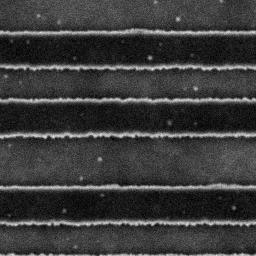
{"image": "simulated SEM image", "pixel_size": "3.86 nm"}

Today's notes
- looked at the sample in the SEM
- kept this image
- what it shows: lines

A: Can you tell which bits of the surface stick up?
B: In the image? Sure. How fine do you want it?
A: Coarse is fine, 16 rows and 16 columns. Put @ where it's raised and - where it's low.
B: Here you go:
----------------
----------------
@@@@@@@@@@@@@@@@
@@@@@@@@@@@@@@@@
----------------
----------------
@@@@@@@@@@@@@@@@
@@@@@@@@@@@@@@@@
@@@@@@@@-@@@@@@@
----------------
----------------
----------------
@@@@@@@@@@@@@@@@
@@@@@@@@@@@@@@@@
----------------
----------------